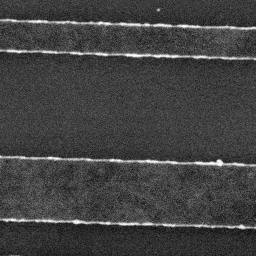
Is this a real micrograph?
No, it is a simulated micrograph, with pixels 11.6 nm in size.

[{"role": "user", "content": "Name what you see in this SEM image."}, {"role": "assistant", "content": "lines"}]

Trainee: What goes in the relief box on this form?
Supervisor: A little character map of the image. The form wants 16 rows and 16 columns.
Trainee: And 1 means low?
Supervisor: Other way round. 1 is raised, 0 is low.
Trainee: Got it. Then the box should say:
0000000000000000
1111111000000000
1111111111111111
0000000001111111
0000000000000000
0000000000000000
0000000000000000
0000000000000000
0000000000000000
0000000000000000
1111111111111111
1111111111111111
1111111111111111
1111111111111111
0000000000000000
0000000000000000